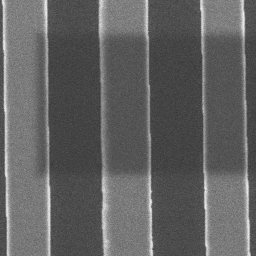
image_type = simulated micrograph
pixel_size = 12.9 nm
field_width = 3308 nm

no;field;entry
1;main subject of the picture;lines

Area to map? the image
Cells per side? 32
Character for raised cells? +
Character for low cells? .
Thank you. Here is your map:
++++++.......+++++.......+++++..
++++++.......+++++.......+++++..
++++++.......+++++.......+++++..
++++++.......+++++.......+++++..
++++++.......++++++......+++++..
++++++.......++++++......+++++..
++++++.......++++++......+++++..
.+++++.......++++++......++++++.
.+++++.......++++++......++++++.
.+++++.......++++++......++++++.
.+++++.......++++++......++++++.
.+++++.......++++++......++++++.
.+++++.......++++++......++++++.
.+++++.......++++++......++++++.
.+++++.......++++++......++++++.
.+++++.......++++++......++++++.
.+++++.......++++++......++++++.
.+++++.......++++++......++++++.
.+++++.......++++++......++++++.
.+++++.......++++++......++++++.
.+++++.......++++++......++++++.
.+++++.......++++++......++++++.
.+++++.......++++++.......+++++.
.+++++.......++++++.......+++++.
.+++++.......++++++.......+++++.
.+++++.......++++++.......+++++.
.+++++.......++++++.......+++++.
.+++++.......++++++.......+++++.
.+++++.......++++++.......+++++.
.+++++.......++++++.......+++++.
.+++++.......++++++.......+++++.
.+++++.......++++++.......+++++.